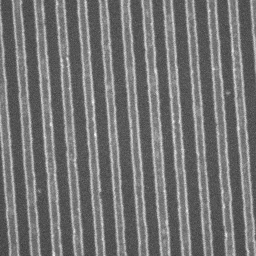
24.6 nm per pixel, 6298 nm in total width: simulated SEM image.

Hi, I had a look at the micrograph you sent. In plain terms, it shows parallel lines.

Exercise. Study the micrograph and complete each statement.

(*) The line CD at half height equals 337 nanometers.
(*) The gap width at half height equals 7.73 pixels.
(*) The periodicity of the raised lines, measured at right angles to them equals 530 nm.